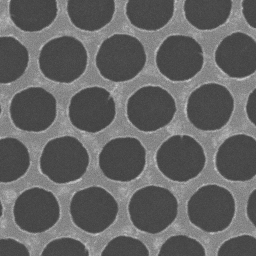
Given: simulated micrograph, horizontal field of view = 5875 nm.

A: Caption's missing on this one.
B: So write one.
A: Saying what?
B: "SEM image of a regular array of holes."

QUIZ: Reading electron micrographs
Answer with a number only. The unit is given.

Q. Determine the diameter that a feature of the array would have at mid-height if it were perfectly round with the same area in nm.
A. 1090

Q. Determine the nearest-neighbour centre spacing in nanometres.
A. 1330